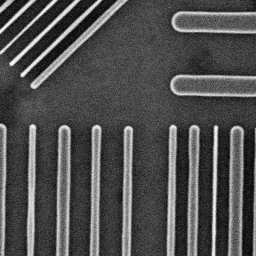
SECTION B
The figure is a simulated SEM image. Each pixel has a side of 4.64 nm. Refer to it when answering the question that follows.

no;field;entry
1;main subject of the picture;groups of lines, slits or small figures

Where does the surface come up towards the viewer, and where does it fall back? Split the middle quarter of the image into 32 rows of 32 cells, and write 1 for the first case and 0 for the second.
00000000000000000000000000000000
00000000000000000000000000000000
00000000000000000000000000000000
00000000000000000000000000001111
00000000000000000000000000011111
00000000000000000000000000011111
00000000000000000000000000011111
00000000000000000000000000001111
00000000000000000000000000000000
00000000000000000000000000000000
00000000000000000000000000000000
00000000000000000000000000000000
00000000000000000000000000000000
00000000000000000000000000000000
00000000000000000000000000000000
00000000000000000000000000000000
10000001100000011000000000110000
10000001100000011000000000110001
10000001100000011000000000110001
10000001100000011000000000110001
10000001100000011000000000110001
10000001100000011000000000110001
10000001100000011000000000110001
10000001100000011000000000110001
10000001100000011000000000110001
10000001100000011000000000110000
10000001100000011000000000110000
10000001100000011000000000110001
10000001100000011000000000110001
10000001100000011000000000110001
10000001100000011000000000110001
10000001100000011000000000110001